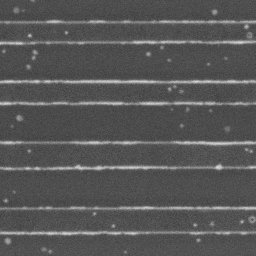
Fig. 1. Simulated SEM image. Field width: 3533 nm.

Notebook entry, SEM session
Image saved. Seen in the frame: lines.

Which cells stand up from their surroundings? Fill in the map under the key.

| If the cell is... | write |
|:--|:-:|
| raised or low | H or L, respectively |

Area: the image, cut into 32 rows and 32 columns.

LLLLLLLLLLLLLLLLLLLLLLLLLLLLLLLL
LLLLLLLLLLLLLLLLLLLLLLLLLLLLLLLL
LLLLLLLLLLLLLLLLLLLLLLLLLLLLLLLL
HHHHHHHHHHHHHHHHHHHHHHHHHHHHHHHH
HHHHHHHHHHHHHHHHHHHHHHHHHHHHHHHH
LLLLLLLLLLLLLLLLLLLLLLLLLLLLLLLL
LLLLLLLLLLLLLLLLLLLLLLLLLLLLLLLL
LLLLLLLLLLLLLLLLLLLLLLLLLLLLLLLL
LLLLLLLLLLLLLLLLLLLLLLLLLLLLLLLL
LLLLLLLLLLLLLLLLLLLLLLLLLLLLLLLL
HHHHHHHHHHHHHHHHHHHHHHHHHHHHHHHH
HHHHHHHHHHHHHHHHHHHHHHHHHHHHHHHH
HHHHHHHHHHHHHHHHHHHHHHHHHHHHHHHH
LLLLLLLLLLLLLLLLLLLLLLLLLLLLLLLL
LLLLLLLLLLLLLLLLLLLLLLLLLLLLLLLL
LLLLLLLLLLLLLLLLLLLLLLLLLLLLLLLL
LLLLLLLLLLLLLLLLLLLLLLLLLLLLLLLL
LLLLLLLLLLLLLLLLLLLLLLLLLLLLLLLL
HHHHHHHHHHHHHHHHHHHHHHHHHHHHHHHH
HHHHHHHHHHHHHHHHHHHHHHHHHHHHHHHH
HHHHHHHHHHHHHHHHHHHHHHHHHHHHHHHH
LLLLLLLLLLLLLLLLLLLLLLLLLLLLLLLL
LLLLLLLLLLLLLLLLLLLLLLLLLLLLLLLL
LLLLLLLLLLLLLLLLLLLLLLLLLLLLLLLL
LLLLLLLLLLLLLLLLLLLLLLLLLLLLLLLL
LLLLLLLLLLLLLLLLLLLLLLLLLLLLLLLL
HHHHHHHHHHHHHHHHHHHHHHHHHHHHHHHH
HHHHHHHHHHHHHHHHHHHHHHHHHHHHHHHH
HHHHHHHHHHHHHHHHHHHHHHHHHHHHHHHH
LLLLLLLLLLLLLLLLLLLLLLLLLLLLLLLL
LLLLLLLLLLLLLLLLLLLLLLLLLLLLLLLL
LLLLLLLLLLLLLLLLLLLLLLLLLLLLLLLL